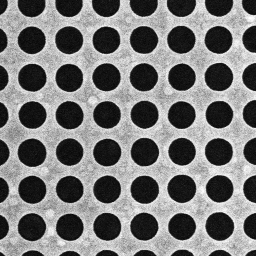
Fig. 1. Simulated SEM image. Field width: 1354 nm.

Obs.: a regular array of holes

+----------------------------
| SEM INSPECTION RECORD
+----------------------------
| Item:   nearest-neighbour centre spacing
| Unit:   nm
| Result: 196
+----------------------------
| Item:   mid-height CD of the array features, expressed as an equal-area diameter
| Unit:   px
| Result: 28.3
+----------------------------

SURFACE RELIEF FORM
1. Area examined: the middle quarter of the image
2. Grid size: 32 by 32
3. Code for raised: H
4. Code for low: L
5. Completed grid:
LLLHHHHHHLLLLHHHHHLLLLHHHHHHLLLH
LLLLHHHHLLLLLLHHHLLLLLLHHHLLLLLL
LLLLLHHLLLLLLLHHHLLLLLLLHHLLLLLL
LLLLLHHLLLLLLLHHLLLLLLLLHHLLLLLL
LLLLLHHLLLLLLLHHHLLLLLLHHHLLLLLL
LLLLHHHHLLLLLLHHHLLLLLLHHHHLLLLL
LLLHHHHHHLLLHHHHHHLLLLHHHHHHLLLH
HHHHHHHHHHHHHHHHHHHHHHHHHHHHHHHH
HHHHHHHHHHHHHHHHHHHHHHHHHHHHHHHH
LLHHHHHHHLLLHHHHHHHLLLHHHHHHLLLH
LLLLHHHHLLLLLHHHHLLLLLLHHHHLLLLL
LLLLLHHLLLLLLLHHHLLLLLLHHHLLLLLL
LLLLLHHLLLLLLLHHHLLLLLLLHHLLLLLL
LLLLLHHLLLLLLLHHHLLLLLLLHHLLLLLL
LLLLLHHHLLLLLLHHHLLLLLLHHHLLLLLL
LLLLHHHHHLLLLHHHHHLLLLHHHHHLLLLH
HHHHHHHHHHHHHHHHHHHHHHHHHHHHHHHH
HHHHHHHHHHHHHHHHHHHHHHHHHHHHHHHH
HLHHHHHHHHHHHHHHHHHHLHHHHHHHHLHH
LLLLHHHHLLLLLHHHHHLLLLLHHHHLLLLL
LLLLHHHHLLLLLLHHHLLLLLLHHHLLLLLL
LLLLLHHLLLLLLLHHHLLLLLLLHHLLLLLL
LLLLLHHLLLLLLLHHHLLLLLLLHHLLLLLL
LLLLLHHHLLLLLLHHHLLLLLLLHHLLLLLL
LLLLHHHHLLLLLHHHHHLLLLLHHHHLLLLL
HLHHHHHHHHLLHHHHHHHLLHHHHHHHHHHH
HHHHHHHHHHHHHHHHHHHHHHHHHHHHHHHH
HHHHHHHHHHHHHHHHHHHHHHHHHHHHHHHH
LLLHHHHHHLLLLHHHHHLLLLHHHHHLLLLL
LLLLHHHHLLLLLLHHHLLLLLLHHHLLLLLL
LLLLLHHLLLLLLLHHHLLLLLLLHHLLLLLL
LLLLLHHLLLLLLLHHLLLLLLLLHHLLLLLL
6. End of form